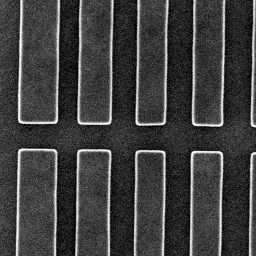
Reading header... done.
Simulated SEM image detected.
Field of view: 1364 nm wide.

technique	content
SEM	groups of lines, slits or small figures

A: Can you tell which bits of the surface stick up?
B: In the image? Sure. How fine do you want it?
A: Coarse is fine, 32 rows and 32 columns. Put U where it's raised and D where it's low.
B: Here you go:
DDDUUUUDDDUUUUDDDUUUUDDDUUUUDDDD
DDDUUUUDDDUUUUDDDUUUUDDDUUUUDDDD
DDDUUUUDDDUUUUDDDUUUUDDDUUUUDDDD
DDDUUUUDDDUUUUDDDUUUUDDDUUUUDDDD
DDDUUUUDDDUUUUDDDUUUUDDDUUUUDDDD
DDDUUUUDDDUUUUDDDUUUUDDDUUUUDDDD
DDDUUUUDDDUUUUDDDUUUUDDDUUUUDDDD
DDDUUUUDDDUUUUDDDUUUUDDDUUUUDDDD
DDDUUUUDDDUUUUDDDUUUUDDDUUUUDDDD
DDDUUUUDDDUUUUDDDUUUUDDDUUUUDDDD
DDUUUUUDDDUUUUDDDUUUUDDDUUUUDDDD
DDUUUUUDDDUUUUDDDUUUUDDDUUUUDDDD
DDUUUUUDDDUUUUDDDUUUUDDDUUUUDDDD
DDUUUUUDDDUUUUDDDUUUUDDDUUUUDDDU
DDUUUUUDDDUUUUDDDUUUUDDDUUUUDDDU
DDDDDDDDDDDDDDDDDUUUDDDDUUUUDDDD
DDDDDDDDDDDDDDDDDDDDDDDDDDDDDDDD
DDDDDDDDDDDDDDDDDDDDDDDDDDDDDDDD
DDDDDDDDDDDDDDDDDDDDDDDDDDDDDDDD
DDUUUUUDDDUUUUDDDUUUUDDDUUUUDDDD
DDUUUUUDDDUUUUDDDUUUUDDDUUUUDDDU
DDUUUUUDDDUUUUDDDUUUUDDDUUUUDDDU
DDUUUUUDDDUUUUDDDUUUUDDDUUUUDDDU
DDUUUUUDDDUUUUDDDUUUUDDDUUUUDDDU
DDUUUUUDDDUUUUDDDUUUUDDDUUUUDDDU
DDUUUUUDDDUUUUDDDUUUDDDDUUUUDDDU
DDUUUUUDDDUUUUDDDUUUDDDDUUUUDDDU
DDUUUUUDDDUUUUDDDUUUDDDDUUUUDDDU
DDUUUUUDDDUUUUDDDUUUDDDDUUUUDDDU
DDUUUUUDDDUUUUDDDUUUDDDDUUUUDDDU
DDUUUUUDDDUUUUDDDUUUDDDDUUUUDDDU
DDUUUUUDDDUUUUDDDUUUDDDDUUUDDDDU